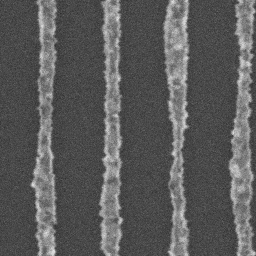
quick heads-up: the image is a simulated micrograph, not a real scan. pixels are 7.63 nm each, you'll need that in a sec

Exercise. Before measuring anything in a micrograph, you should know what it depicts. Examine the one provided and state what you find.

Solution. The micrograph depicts one or a few lines or trenches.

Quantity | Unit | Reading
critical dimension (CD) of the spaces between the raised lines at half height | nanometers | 408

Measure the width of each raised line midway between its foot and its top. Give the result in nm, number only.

98.3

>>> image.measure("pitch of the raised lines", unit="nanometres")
502